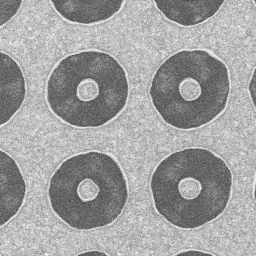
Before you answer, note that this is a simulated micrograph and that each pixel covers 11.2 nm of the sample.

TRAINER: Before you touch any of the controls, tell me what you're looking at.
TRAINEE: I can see ring-shaped grooves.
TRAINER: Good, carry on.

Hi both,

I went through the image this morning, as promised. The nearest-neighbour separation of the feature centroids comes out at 1120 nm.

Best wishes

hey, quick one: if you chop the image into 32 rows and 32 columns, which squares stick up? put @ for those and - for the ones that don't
---@@@@--------@@@@@--------@@@@
--@@@@@--------@@@@@-------@@@@@
-@@@@@@@@----@@@@@@@@-----@@@@@@
@@@@@@@@@@@@@@@@@@@@@@@@@@@@@@@@
@@@@@@@@@@@@@@@@@@@@@@@@@@@@@@@@
@@@@@@@@@@@@@@@@@@@@@@@@@@@@@@@@
@@@@@@@@@@--@@@@@@@@@@----@@@@@@
--@@@@@@------@@@@@@@------@@@@@
--@@@@@--------@@@@@--------@@@@
---@@@----------@@@----------@@@
---@@@----@@----@@@----@@----@@-
---@@@----@@----@@@----@@----@@-
---@@@----@-----@@@---------@@@-
--@@@@---------@@@@---------@@@@
--@@@@@-------@@@@@@-------@@@@@
@@@@@@@@@----@@@@@@@@-----@@@@@@
@@@@@@@@@@@@@@@@@@@@@@@@@@@@@@@@
@@@@@@@@@@@@@@@@@@@@@@@@@@@@@@@@
@@@@@@@@@@@@@@@@@@@@@@@@@@@@@@@@
-@@@@@@@@-----@@@@@@@------@@@@@
--@@@@@@-------@@@@@--------@@@@
---@@@@--------@@@@----------@@@
---@@@----------@@@----@-----@@@
---@@@----@@----@@@---@@@----@@@
---@@@----@@----@@@----@@----@@@
---@@@----------@@@---------@@@@
--@@@@@--------@@@@@--------@@@@
-@@@@@@@------@@@@@@@-----@@@@@@
@@@@@@@@@---@@@@@@@@@@@--@@@@@@@
@@@@@@@@@@@@@@@@@@@@@@@@@@@@@@@@
@@@@@@@@@@@@@@@@@@@@@@@@@@@@@@@@
@@@@@@@@@@@--@@@@@@@@@@--@@@@@@@